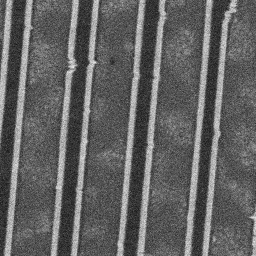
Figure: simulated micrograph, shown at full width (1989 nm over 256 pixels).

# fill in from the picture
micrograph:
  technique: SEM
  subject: one or a few lines or trenches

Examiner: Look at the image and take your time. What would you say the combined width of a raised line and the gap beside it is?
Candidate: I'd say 0.514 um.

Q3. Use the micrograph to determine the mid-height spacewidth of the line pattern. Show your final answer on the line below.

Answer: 345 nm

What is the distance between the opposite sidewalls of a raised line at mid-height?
171 nm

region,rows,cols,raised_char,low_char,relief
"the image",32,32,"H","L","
LHHHLLLLLHHHLLLLLLHHLLLLLLHHHLLL
LHHHLLLLLHHHLLLLLLHHLLLLLLHHHLLL
LHHHLLLLLHHHLLLLLHHHLLLLLLHHHLLL
LHHHLLLLLHHHLLLLLHHHLLLLLLHHLLLL
LHHLLLLLLHHHLLLLLHHHLLLLLLHHLLLL
LHHLLLLLLHHHLLLLLHHHLLLLLLHHLLLL
LHHLLLLLLHHHLLLLLHHHLLLLLLHHLLLL
LHHLLLLLLHHHLLLLLHHHLLLLLLHHLLLL
HHHLLLLLLHHLLLLLLHHHLLLLLHHHLLLL
HHHLLLLLLHHLLLLLLHHHLLLLLHHHLLLL
HHHLLLLLHHHLLLLLLHHHLLLLLHHHLLLL
HHHLLLLLHHHLLLLLLHHLLLLLLHHHLLLL
HHHLLLLLHHHLLLLLLHHLLLLLLHHLLLLL
HHHLLLLLHHHLLLLLLHHLLLLLLHHLLLLL
HHHLLLLLHHHLLLLLHHHLLLLLLHHLLLLL
HHLLLLLLHHHLLLLLHHHLLLLLLHHLLLLL
HHLLLLLLHHHLLLLLHHHLLLLLLHHLLLLL
HHLLLLLLHHHLLLLLHHHLLLLLLHHLLLLL
HHLLLLLLHHHLLLLLHHHLLLLLLHHLLLLL
HHLLLLLLHHLLLLLLHHHLLLLLHHHLLLLL
HHLLLLLLHHLLLLLLHHHLLLLLHHHLLLLL
HHLLLLLLHHLLLLLLHHHLLLLLHHHLLLLL
HHLLLLLHHHLLLLLLHHLLLLLLHHHLLLLL
HHLLLLLHHHLLLLLLHHLLLLLLHHHLLLLL
HHLLLLLHHHLLLLLLHHLLLLLLHHLLLLLL
HHLLLLLHHHLLLLLLHHLLLLLLHHLLLLLL
HLLLLLLHHHLLLLLHHHLLLLLLHHLLLLLL
HLLLLLLHHHLLLLLHHHLLLLLLHHLLLLLL
HLLLLLLHHHLLLLLHHHLLLLLLHHLLLLLL
HLLLLLLHHHLLLLLHHHLLLLLHHHLLLLLL
HLLLLLLHHLLLLLLHHHLLLLLHHHLLLLLL
HLLLLLLHHLLLLLLHHHLLLLLHHHLLLLLL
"